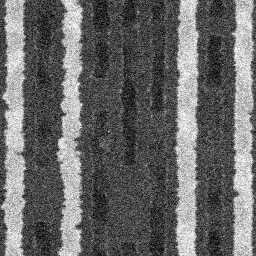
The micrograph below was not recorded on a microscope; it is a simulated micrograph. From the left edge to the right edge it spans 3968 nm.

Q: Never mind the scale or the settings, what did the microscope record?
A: parallel lines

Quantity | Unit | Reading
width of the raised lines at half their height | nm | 246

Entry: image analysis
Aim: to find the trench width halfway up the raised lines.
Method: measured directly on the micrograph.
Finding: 194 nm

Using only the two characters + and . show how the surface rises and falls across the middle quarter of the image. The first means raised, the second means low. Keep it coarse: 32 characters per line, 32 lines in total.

++++....++++...++++...+++....+++
.+++...++++....+++....+++....+++
.+++...++++....+++....+++....+++
+++....++++....+++....+++....+++
+++............+++....+++....+++
+++...........++++....+++....+++
+++...........++++....+++...++++
++++..........++++....+++....+++
+++...........++++....+++....+++
++++...........+++....+++....+++
++++..........++++....+++....+++
++++...........++++..++++....+++
.+++...++++...+++++...+++....+++
+++....++++...+++++.........++++
++++...++++...++++...........+++
++++...++++...++++...........+++
++++...++++....++++..........+++
++++...+++++..++++..........++++
+++....+++++..+++++.........++++
+++...+++.....++++...++++...++++
+++...+++.....++++...++++...++++
+++....++++...++++...++++...++++
++++...+++....++++...++++...++++
++++...+++....++++....+++....+++
++++...+++....++++...+++++...+++
++++...++++..........+++++...+++
++++...++++..........+++++...+++
+++....++++..........+++++...+++
++++...++++..........+++++...+++
++++...++++...........+++....+++
++++...++++..........+++++...+++
++++...++++..........+++++...+++